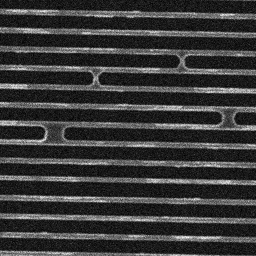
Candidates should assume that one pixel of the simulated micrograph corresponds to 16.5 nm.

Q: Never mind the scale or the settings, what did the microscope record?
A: parallel lines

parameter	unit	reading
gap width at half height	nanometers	229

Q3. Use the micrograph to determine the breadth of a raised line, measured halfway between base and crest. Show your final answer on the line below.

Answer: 84.7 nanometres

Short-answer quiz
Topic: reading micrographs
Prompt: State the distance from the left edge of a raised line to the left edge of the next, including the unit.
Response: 18.6 pixels